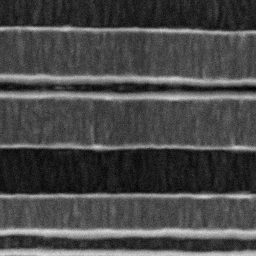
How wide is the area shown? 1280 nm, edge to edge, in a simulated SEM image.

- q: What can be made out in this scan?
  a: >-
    lines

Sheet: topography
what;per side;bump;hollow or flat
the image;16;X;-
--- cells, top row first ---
----------------
----------------
XXXXXXXXXXXXXXXX
XXXXXXXXXXXXXXXX
XXXXXXXXXXXXXXXX
XXXXXXXXXXXXXXXX
XXXXXXXXXXXXXXXX
XXXXXXXXXXXXXXXX
XXXXXXXXXXXXXXXX
----------------
----------------
----------------
XXXXXXXXXXXXXXXX
XXXXXXXXXXXXXXXX
XXXXXXXXXXXXXXXX
XXXXXXXXXXXXXXXX